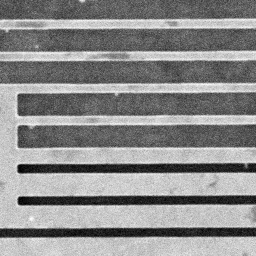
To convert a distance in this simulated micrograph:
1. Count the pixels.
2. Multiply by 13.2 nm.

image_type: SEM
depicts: groups of lines, slits or small figures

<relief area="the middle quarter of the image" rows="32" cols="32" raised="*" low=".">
................................
................................
................................
................................
................................
********************************
********************************
................................
................................
................................
................................
................................
................................
********************************
********************************
................................
................................
................................
................................
................................
................................
********************************
********************************
********************************
********************************
................................
................................
********************************
********************************
********************************
********************************
********************************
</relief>